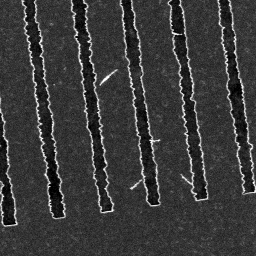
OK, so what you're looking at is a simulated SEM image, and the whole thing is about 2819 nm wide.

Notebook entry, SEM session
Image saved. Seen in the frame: parallel lines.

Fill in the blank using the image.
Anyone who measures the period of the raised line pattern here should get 531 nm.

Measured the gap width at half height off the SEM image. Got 11.4 pixels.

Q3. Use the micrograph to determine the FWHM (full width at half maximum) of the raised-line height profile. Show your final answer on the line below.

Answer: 0.411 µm